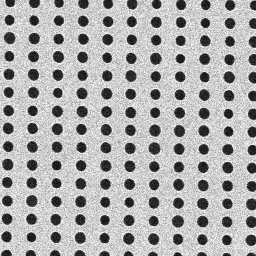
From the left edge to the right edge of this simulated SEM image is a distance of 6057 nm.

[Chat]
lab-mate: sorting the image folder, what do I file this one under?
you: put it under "a regular array of holes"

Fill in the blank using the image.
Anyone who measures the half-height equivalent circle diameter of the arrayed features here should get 265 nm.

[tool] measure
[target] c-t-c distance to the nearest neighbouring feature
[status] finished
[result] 424 nm